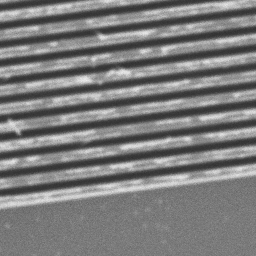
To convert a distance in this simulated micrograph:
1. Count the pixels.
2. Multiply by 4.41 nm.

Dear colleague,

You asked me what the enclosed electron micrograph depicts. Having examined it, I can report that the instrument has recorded parallel lines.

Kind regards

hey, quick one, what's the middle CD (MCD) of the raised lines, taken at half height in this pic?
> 44.8 nanometers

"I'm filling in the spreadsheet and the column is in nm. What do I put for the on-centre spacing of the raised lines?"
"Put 81.2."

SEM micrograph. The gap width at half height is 36.6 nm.